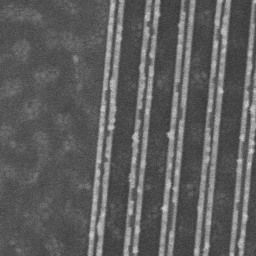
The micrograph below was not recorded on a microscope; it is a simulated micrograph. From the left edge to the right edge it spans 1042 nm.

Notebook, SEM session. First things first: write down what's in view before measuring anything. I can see parallel lines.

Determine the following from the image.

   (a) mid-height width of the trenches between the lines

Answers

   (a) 91.3 nm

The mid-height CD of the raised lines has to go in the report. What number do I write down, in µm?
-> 0.0511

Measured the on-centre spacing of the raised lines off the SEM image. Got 0.144 um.